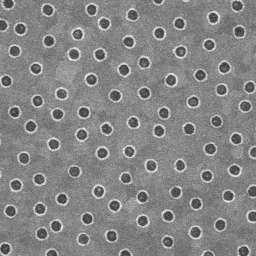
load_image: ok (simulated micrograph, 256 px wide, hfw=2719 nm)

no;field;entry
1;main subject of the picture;a regular array of holes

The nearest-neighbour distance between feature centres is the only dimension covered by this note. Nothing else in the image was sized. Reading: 261 nanometres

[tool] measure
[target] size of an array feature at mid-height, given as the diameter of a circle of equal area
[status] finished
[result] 117 nm